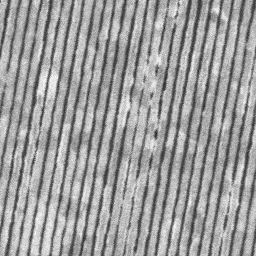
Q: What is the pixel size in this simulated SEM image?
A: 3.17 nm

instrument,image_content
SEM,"parallel lines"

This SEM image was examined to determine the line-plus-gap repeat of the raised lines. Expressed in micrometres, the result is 0.0333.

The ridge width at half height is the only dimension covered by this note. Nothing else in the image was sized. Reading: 21.9 nm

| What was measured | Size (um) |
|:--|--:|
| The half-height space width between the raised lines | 0.0109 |